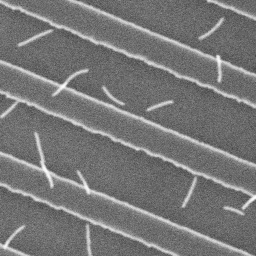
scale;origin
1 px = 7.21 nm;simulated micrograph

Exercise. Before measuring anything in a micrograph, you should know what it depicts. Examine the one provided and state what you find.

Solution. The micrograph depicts lines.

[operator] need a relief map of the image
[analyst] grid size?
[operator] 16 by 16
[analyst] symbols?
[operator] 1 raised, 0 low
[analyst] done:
0111110000000011
0001111100000000
0000001111100000
0000000011111000
1100000000011111
1111000000000111
0011111000000001
0000111110000000
0000000111110000
0000000001111100
1110000000011111
1111100000000011
0011111000000000
0000011111000000
0000000111110000
1000000000111110